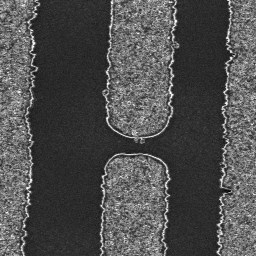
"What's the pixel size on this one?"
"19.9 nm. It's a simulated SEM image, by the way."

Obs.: one or a few lines or trenches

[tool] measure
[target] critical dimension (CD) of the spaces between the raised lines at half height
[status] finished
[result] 1420 nanometres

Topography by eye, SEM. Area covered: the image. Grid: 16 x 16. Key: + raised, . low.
++.....++++...++
++.....++++...++
++.....++++...++
++.....++++...++
++.....++++...++
++.....++++...++
++.....++++...++
++.....++++...++
++......++....++
++............++
++.....+++....++
++....++++....++
++....++++....++
++....++++....++
++....++++....++
+.....++++....++